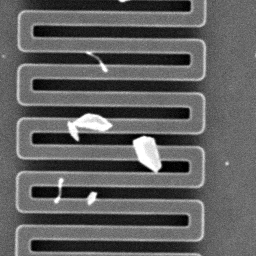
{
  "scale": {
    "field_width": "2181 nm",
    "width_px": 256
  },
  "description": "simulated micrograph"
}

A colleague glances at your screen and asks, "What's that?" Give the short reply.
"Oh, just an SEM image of groups of lines, slits or small figures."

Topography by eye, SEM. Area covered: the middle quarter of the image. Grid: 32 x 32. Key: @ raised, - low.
@@@@@@@@@@@@@@@@@@@------------@
@@@@@@@@@@@@@@@@@@@@@@@@@@@@@@@@
@@@@@@@@@@@@@@@@@@@@@@@@@@@@@@@@
@@@@@@@@@@@@@@@@@@@@@@@@@@@@@@@@
--------------------------------
--------------------------------
--------------------------------
@@@@@@@@@@@@@@@@@@@@@@@@@@@@@@@@
@@@@@@@@@@@@@@@@@@@@@@@@@@@@@@@@
@@@@@@@@@@@@@@@@@@@@@@@@@@@@@@@@
---@@@@@@@@@@@@@@@@@@@@@@@@@@@@@
--------------------------------
--------------------------------
----@@@@@@---------------------@
@@@@@@@@@@@@@@@@@@@@@@@@@@@@@@@@
@@@@@@@@@@@@@@@@@@@@@@@@@@@@@@@@
@@@@@@@@@@@@@@@@@@@@@@@@@@@@@@@@
--@@----------------------------
---@---------------@@@----------
-----------------@@@@@@---------
@@@@-------------@@@@@@---------
@@@@@@@@@@@@@@@@@@@@@@@@@@@@@@@@
@@@@@@@@@@@@@@@@@@@@@@@@@@@@@@@@
@@@@@@@@@@@@@@@@@@@@@@@@@@@@@@@@
-------------------@@@@@-------@
---------------------@@@--------
----------------------@@-------@
@@@@@@@@@@@@@@@@@@@@@@@@@@@@@@@@
@@@@@@@@@@@@@@@@@@@@@@@@@@@@@@@@
@@@@@@@@@@@@@@@@@@@@@@@@@@@@@@@@
----------@@@@@@@@@@@@@@@@@@@@@@
--------------------------------